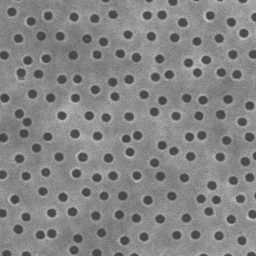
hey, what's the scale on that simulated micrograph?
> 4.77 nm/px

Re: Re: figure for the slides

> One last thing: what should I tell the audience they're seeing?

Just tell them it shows a regular array of holes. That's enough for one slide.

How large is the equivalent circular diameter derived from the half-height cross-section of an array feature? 43.8 nm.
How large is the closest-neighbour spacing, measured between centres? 82 nm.